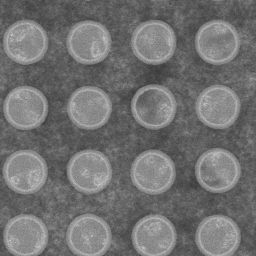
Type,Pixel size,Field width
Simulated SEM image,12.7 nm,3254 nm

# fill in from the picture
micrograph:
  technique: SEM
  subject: a regular array of raised bodies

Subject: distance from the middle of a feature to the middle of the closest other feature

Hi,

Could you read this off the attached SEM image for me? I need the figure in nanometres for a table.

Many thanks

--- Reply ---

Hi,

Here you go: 809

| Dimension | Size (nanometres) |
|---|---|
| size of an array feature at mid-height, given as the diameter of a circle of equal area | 523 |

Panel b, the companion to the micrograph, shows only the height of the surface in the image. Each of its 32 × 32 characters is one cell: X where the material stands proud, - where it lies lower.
--------------------------------
--------------------------------
--------------------------------
-XXXX----XXXX----XXXX----XXXX---
-XXXXX---XXXXX---XXXXX---XXXXX--
-XXXXX---XXXXX---XXXXX---XXXXX--
-XXXX----XXXX----XXXX----XXXXX--
--XX------XX------XXX-----XX----
--------------------------------
--------------------------------
--------------------------------
--XXX-----XXX----XXXX-----XXX---
-XXXXX---XXXXX---XXXXX---XXXXX--
-XXXXX---XXXXX---XXXXX---XXXXX--
-XXXXX---XXXXX---XXXXX---XXXX---
--XXX-----XXX-----XXX-----XXX---
--------------------------------
--------------------------------
--------------------------------
--XXX-----XXX-----XXX----XXXX---
-XXXXX---XXXXX---XXXX----XXXXX--
-XXXXX---XXXXX---XXXXX---XXXXX--
-XXXXX---XXXXX---XXXX----XXXXX--
--XXX-----XXX-----XXX-----XXX---
--------------------------------
--------------------------------
--------------------------------
--XXX-----XXX-----XXX-----XXX---
-XXXXX---XXXX----XXXXX---XXXXX--
-XXXXX---XXXXX---XXXXX---XXXXX--
-XXXXX---XXXXX---XXXXX---XXXXX--
--XXX-----XXX-----XXX-----XXX---